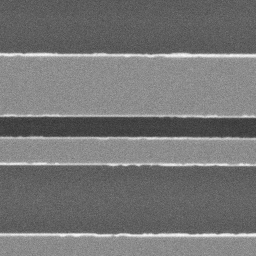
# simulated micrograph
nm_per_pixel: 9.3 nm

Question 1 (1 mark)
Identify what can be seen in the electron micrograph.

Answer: lines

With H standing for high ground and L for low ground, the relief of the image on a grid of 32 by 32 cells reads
LLLLLLLLLLLLLLLLLLLLLLLLLLLLLLLL
LLLLLLLLLLLLLLLLLLLLLLLLLLLLLLLL
LLLLLLLLLLLLLLLLLLLLLLLLLLLLLLLL
LLLLLLLLLLLLLLLLLLLLLLLLLLLLLLLL
LLLLLLLLLLLLLLLLLLLLLLLLLLLLLLLL
LLLLLLLLLLLLLLLLLLLLLLLLLLLLLLLL
LLLLLLLLLLLLLLLLLLLLLLLLLLLLLLLL
HHHHHHHHHHHHHHHHHHHHHHHHHHHHHHHH
HHHHHHHHHHHHHHHHHHHHHHHHHHHHHHHH
HHHHHHHHHHHHHHHHHHHHHHHHHHHHHHHH
HHHHHHHHHHHHHHHHHHHHHHHHHHHHHHHH
HHHHHHHHHHHHHHHHHHHHHHHHHHHHHHHH
HHHHHHHHHHHHHHHHHHHHHHHHHHHHHHHH
HHHHHHHHHHHHHHHHHHHHHHHHHHHHHHHH
HHHHHHHHHHHHHHHHHHHHHHHHHHHHHHHH
LLLLLLLLLLLLLLLLLLLLLLLLLLLLLLLL
LLLLLLLLLLLLLLLLLLLLLLLLLLLLLLLL
HHHHHHHHHHHHHHHHHHHHHHHHHHHHHHHH
HHHHHHHHHHHHHHHHHHHHHHHHHHHHHHHH
HHHHHHHHHHHHHHHHHHHHHHHHHHHHHHHH
HHHHHHHHHHHHHHHHHHHHHHHHHHHHHHHH
LLLLLLLLLLLLLLLLLLLLLLLLLLLLLLLL
LLLLLLLLLLLLLLLLLLLLLLLLLLLLLLLL
LLLLLLLLLLLLLLLLLLLLLLLLLLLLLLLL
LLLLLLLLLLLLLLLLLLLLLLLLLLLLLLLL
LLLLLLLLLLLLLLLLLLLLLLLLLLLLLLLL
LLLLLLLLLLLLLLLLLLLLLLLLLLLLLLLL
LLLLLLLLLLLLLLLLLLLLLLLLLLLLLLLL
LLLLLLLLLLLLLLLLLLLLLLLLLLLLLLLL
HHHHHHHHHHHHHHHHHHHHHHHHHHHHHHHH
HHHHHHHHHHHHHHHHHHHHHHHHHHHHHHHH
HHHHHHHHHHHHHHHHHHHHHHHHHHHHHHHH